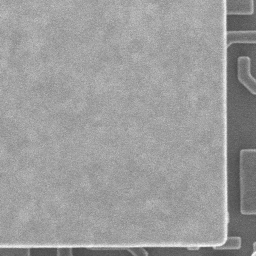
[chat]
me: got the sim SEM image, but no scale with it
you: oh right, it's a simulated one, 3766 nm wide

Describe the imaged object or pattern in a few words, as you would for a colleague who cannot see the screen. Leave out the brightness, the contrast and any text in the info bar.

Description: wiring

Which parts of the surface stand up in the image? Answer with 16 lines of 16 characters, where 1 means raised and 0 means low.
1111111111111100
1111111111111100
1111111111111100
1111111111111100
1111111111111100
1111111111111100
1111111111111100
1111111111111100
1111111111111100
1111111111111100
1111111111111100
1111111111111100
1111111111111100
1111111111111100
1111111111111100
0000000000000000